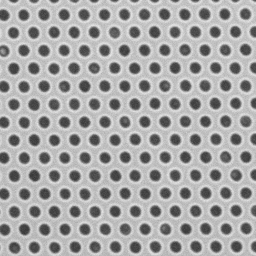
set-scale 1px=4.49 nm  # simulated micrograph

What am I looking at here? a regular array of holes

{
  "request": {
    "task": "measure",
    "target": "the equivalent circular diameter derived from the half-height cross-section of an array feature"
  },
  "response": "0.0546 um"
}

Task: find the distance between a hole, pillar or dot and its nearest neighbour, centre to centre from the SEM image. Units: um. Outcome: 0.0897